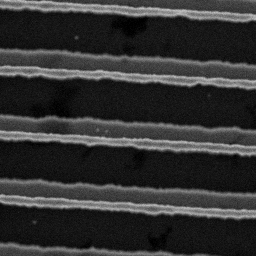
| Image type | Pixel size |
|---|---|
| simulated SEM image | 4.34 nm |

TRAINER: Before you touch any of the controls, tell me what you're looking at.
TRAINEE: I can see lines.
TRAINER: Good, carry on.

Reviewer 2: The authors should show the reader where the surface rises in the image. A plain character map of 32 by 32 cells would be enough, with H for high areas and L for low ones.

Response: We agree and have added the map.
HHHHHHHHHHHHHHHHHHHHHHHHHHHHHHHH
LLLLLLLLLLLLLLHHHHHHHHHHHHHHHHHH
LLLLLLLLLLLLLLLLLLLLLLLLLLLLLHHL
LLLLLLLLLLLLLLLLLLLLLLLLLLLLLLLL
LLLLLLLLLLLLLLLLLLLLLLLLLLLLLLLL
LLLLLLLLLLLLLLLLLLLLLLLLLLLLLLLL
HHHHHHHHLLLLLLLLLLLLLLLLLLLLLLLL
HHHHHHHHHHHHHHHHHHHHHHLLLLLLLLLL
HHHHHHHHHHHHHHHHHHHHHHHHHHHHHHHH
LLLLLLHHHHHHHHHHHHHHHHHHHHHHHHHH
LLLLLLLLLLLLLLLLLLLLLLHHLLHHHHHH
LLLLLLLLLLLLLLLLLLLLLLLLLLLLLLLL
LLLLLLLLLLLLLLLLLLLLLLLLLLLLLLLL
LLLLLLLLLLLLLLLLLLLLLLLLLLLLLLLL
HLLLLLLLLLLLLLLLLLLLLLLLLLLLLLLL
HHHHHHHHHHHHHHHHHHHLLLLLLLLLLLLL
HHHHHHHHHHHHHHHHHHHHHHHHHHHHHHHH
LLLLLHHHHHHHHHHHHHHHHHHHHHHHHHHH
LLLLLLLLLLLLLLLLLLHHHHHHHHHHHHHH
LLLLLLLLLLLLLLLLLLLLLLLLLLLLLLLL
LLLLLLLLLLLLLLLLLLLLLLLLLLLLLLLL
LLLLLLLLLLLLLLLLLLLLLLLLLLLLLLLL
HLLLLLLLLLLLLLLLLLLLLLLLLLLLLLLL
HHHHHHHHHHHHHHHHHLLLLLLLLLLLLLLL
HHHHHHHHHHHHHHHHHHHHHHHHHHHHHHHH
LLHHHHHHHHHHHHHHHHHHHHHHHHHHHHHH
LLLLLLLLLLLLLLLLLLHHHHHHHHHHHHHH
LLLLLLLLLLLLLLLLLLLLLLLLLLLLLLLL
LLLLLLLLLLLLLLLLLLLLLLLLLLLLLLLL
LLLLLLLLLLLLLLLLLLLLLLLLLLLLLLLL
LLLLLLLLLLLLLLLLLLLLLLLLLLLLLLLL
HHHHHHHHHHHHHHLLLLLLLLLLLLLLLLLL